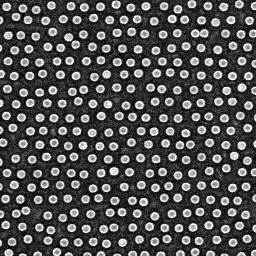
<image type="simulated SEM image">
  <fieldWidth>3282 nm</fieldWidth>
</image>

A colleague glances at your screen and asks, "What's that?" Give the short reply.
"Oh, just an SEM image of a regular array of raised bodies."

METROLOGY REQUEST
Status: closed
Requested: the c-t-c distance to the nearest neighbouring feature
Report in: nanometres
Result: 172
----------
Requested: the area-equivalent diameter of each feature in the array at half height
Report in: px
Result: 7.49